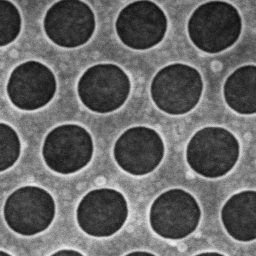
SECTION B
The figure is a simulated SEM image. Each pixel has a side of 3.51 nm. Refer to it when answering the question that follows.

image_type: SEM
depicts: a regular array of holes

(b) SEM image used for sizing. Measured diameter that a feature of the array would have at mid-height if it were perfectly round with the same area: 181 nm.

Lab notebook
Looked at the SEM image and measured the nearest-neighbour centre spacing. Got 254 nm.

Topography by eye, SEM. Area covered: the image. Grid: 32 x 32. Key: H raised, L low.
LLHHHHHLLLLHHHHHLLLHHHHHHLLLLHHH
LLHHHHLLLLLLHHHLLLLLHHHHLLLLLLHH
LLLHHLLLLLLLHHLLLLLLLHHHLLLLLLHH
LLLHHLLLLLLLHHLLLLLLLHHLLLLLLLHH
LLHHHHLLLLLHHHHLLLLLLHHHLLLLLLHH
LHHHHHHLLLLHHHHLLLLLHHHHLLLLLHHH
HHHHHHHHHHHHHHHHHHHHHHHHHLLLHHHH
HHHHHHHHHHHHHHHHHHHHHHHHHHHHHHHH
HHLLLLHHHHHLLLLHHHHHLLLLHHHHHHLL
HLLLLLLHHHLLLLLLHHHLLLLLLHHHHLLL
HLLLLLLHHHLLLLLLHHHLLLLLLHHHLLLL
HLLLLLLHHHLLLLLLHHHLLLLLLHHHLLLL
HLLLLLHHHHLLLLLLHHHLLLLLLHHHLLLL
HHLLLHHHHHHLLLLHHHHHLLLLHHHHHLLL
HHHHHHHHHHHHHHHHHHHHHHHHHHHHHHHH
LHHHHHHHLHHHHHHHHHHHHHHHHHHHHHHH
LLHHHHLLLLLHHHHLLLLLHHHHHLLLLHHH
LLHHHHLLLLLLHHHLLLLLHHHHLLLLLLHH
LLLHHLLLLLLLHHLLLLLLLHHLLLLLLLHH
LLHHHLLLLLLLHHLLLLLLHHHLLLLLLLHH
LLHHHHLLLLLHHHHLLLLLHHHLLLLLLHHH
HHHHHHHLLLHHHHHHLLLHHHHHLLLLLHHH
HHHHHHHHHHHHHHHHHHHHHHHHHHHHHHHH
HHLLLHHHHHHHHLHHHHHHHHHHHHHHHHHH
HLLLLLHHHHHLLLLHHHHHLLLLHHHHHLLL
HLLLLLLHHHLLLLLLHHHLLLLLLHHHLLLL
LLLLLLLHHHLLLLLLHHHLLLLLLHHHLLLL
HLLLLLLHHHLLLLLLHHHLLLLLLHHHLLLL
HLLLLLHHHHLLLLLHHHHLLLLLLHHHLLLL
HHHLHHHHHHHLLLHHHHHHLLLHHHHHHLLL
HHHHHHHHHHHHHHHHHHHHHHHHHHHHHHHH
LHHHHHHLLLHHHHHHLLHHHHHHHHLHHHHH